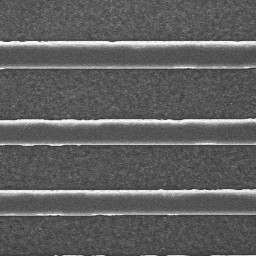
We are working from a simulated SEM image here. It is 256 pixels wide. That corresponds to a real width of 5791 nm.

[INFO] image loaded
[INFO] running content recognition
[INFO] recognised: lines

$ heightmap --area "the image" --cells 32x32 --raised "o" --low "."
................................
................................
................................
................................
................................
oooooooooooooooooooooooooooooooo
oooooooooooooooooooooooooooooooo
oooooooooooooooooooooooooooooooo
o...............................
................................
................................
................................
................................
................................
................................
oooooooooooooooooooooooooooooooo
oooooooooooooooooooooooooooooooo
oooooooooooooooooooooooooooooooo
................................
................................
................................
................................
................................
................................
oooooooooooooooooooooooooooooooo
oooooooooooooooooooooooooooooooo
oooooooooooooooooooooooooooooooo
................................
................................
................................
................................
................................